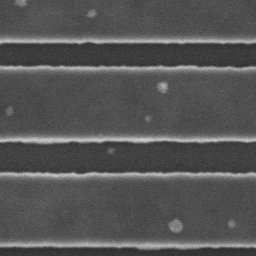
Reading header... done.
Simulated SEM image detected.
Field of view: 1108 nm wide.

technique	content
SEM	lines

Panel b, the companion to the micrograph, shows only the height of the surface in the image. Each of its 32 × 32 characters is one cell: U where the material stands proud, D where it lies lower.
UUUUUUUUUUUUUUUUUUUUUUUUUUUUUUUU
UUUUUUUUUUUUUUUUUUUUUUUUUUUUUUUU
UUUUUUUUUUUUUUUUUUUUUUUUUUUUUUUU
UUUUUUUUUUUUUUUUUUUUUUUUUUUUUUUU
UUUUUUUUUUUUUUUUUUUUUUUUUUUUUUUU
DDDDDDDDDDDDDDDDDDDDDDDDDDDDDDDD
DDDDDDDDDDDDDDDDDDDDDDDDDDDDDDDD
DDDDDDDDDDDDDDDDDDDDDDDDDDDDDDDD
UUUUUUUUUUUUUUUUUUUUUUUUUUUUUUUU
UUUUUUUUUUUUUUUUUUUUUUUUUUUUUUUU
UUUUUUUUUUUUUUUUUUUUUUUUUUUUUUUU
UUUUUUUUUUUUUUUUUUUUUUUUUUUUUUUU
UUUUUUUUUUUUUUUUUUUUUUUUUUUUUUUU
UUUUUUUUUUUUUUUUUUUUUUUUUUUUUUUU
UUUUUUUUUUUUUUUUUUUUUUUUUUUUUUUU
UUUUUUUUUUUUUUUUUUUUUUUUUUUUUUUU
UUUUUUUUUUUUUUUUUUUUUUUUUUUUUUUU
UUUUUUUUUUUUUUUUUUUUUUUUUUUUDUUU
DDDDDDDDDDDDDDDDDDDDDDDDDDDDDDDD
DDDDDDDDDDDDDDDDDDDDDDDDDDDDDDDD
DDDDDDDDDDDDDDDDDDDDDDDDDDDDDDDD
DDDDDDDDDDDDDDDDDDDDDDDDDDDDDDDD
UUUUUUUUUUUUUUUUUUUUUUUUUUUUUUUU
UUUUUUUUUUUUUUUUUUUUUUUUUUUUUUUU
UUUUUUUUUUUUUUUUUUUUUUUUUUUUUUUU
UUUUUUUUUUUUUUUUUUUUUUUUUUUUUUUU
UUUUUUUUUUUUUUUUUUUUUUUUUUUUUUUU
UUUUUUUUUUUUUUUUUUUUUUUUUUUUUUUU
UUUUUUUUUUUUUUUUUUUUUUUUUUUUUUUU
UUUUUUUUUUUUUUUUUUUUUUUUUUUUUUUU
UUUUUUUUUUUUUUUUUUUUUUUUUUUUUUUU
DDDDDDDDDDDDDDDDDDDDDDDDDDDDDDDD